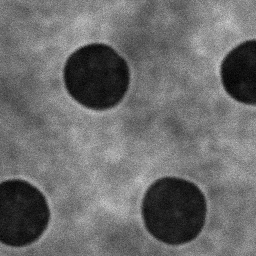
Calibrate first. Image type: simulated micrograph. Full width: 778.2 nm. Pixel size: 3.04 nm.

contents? holes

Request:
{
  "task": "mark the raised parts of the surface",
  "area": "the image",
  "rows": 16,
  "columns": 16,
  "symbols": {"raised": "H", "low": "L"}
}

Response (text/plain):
HHHHHHHHHHHHHHHH
HHHHHHHHHHHHHHHH
HHHHHHHHHHHHHHHH
HHHHLLLLHHHHHHLL
HHHHLLLLHHHHHHLL
HHHHLLLLHHHHHHLL
HHHHHLLHHHHHHHHH
HHHHHHHHHHHHHHHH
HHHHHHHHHHHHHHHH
HHHHHHHHHHHHHHHH
HHHHHHHHHHHHHHHH
LLHHHHHHHHLLHHHH
LLLHHHHHHLLLLHHH
LLLHHHHHHLLLLHHH
LLLHHHHHHLLLLHHH
HHHHHHHHHHHHHHHH